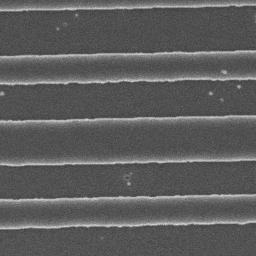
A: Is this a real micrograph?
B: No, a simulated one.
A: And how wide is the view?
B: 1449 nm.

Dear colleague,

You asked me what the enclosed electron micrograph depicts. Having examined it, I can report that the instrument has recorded lines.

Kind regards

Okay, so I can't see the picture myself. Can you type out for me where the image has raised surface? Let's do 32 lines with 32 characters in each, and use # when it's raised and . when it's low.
################################
................................
................................
................................
................................
................................
...........................#.###
################################
################################
################################
.#.#............................
................................
................................
................................
................................
################################
################################
################################
################################
################################
########.#......................
................................
................................
................................
..........................######
################################
################################
################################
###.............................
................................
................................
................................